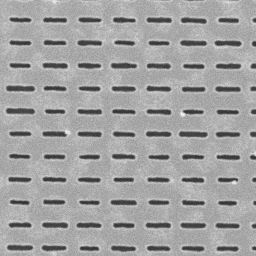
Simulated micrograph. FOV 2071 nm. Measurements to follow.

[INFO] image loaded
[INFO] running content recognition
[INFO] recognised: a regular array of holes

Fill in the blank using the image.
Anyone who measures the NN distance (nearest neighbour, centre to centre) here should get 184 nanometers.